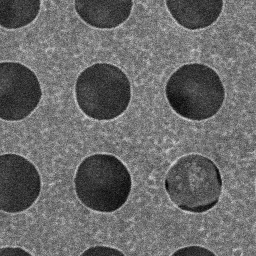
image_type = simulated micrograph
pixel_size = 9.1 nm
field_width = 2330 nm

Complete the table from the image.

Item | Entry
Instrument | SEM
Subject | holes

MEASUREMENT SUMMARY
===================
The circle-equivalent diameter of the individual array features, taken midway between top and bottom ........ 0.528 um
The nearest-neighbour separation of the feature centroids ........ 832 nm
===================